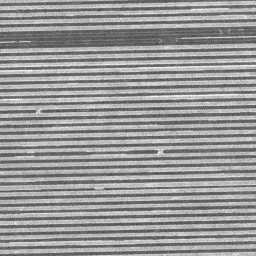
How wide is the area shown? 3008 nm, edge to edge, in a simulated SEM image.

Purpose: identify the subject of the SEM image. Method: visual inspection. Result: parallel lines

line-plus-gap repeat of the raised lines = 84.3 nm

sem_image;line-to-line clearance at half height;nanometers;44.1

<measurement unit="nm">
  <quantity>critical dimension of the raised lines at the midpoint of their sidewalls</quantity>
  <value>42.6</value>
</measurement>